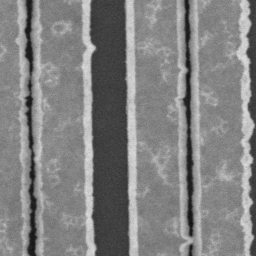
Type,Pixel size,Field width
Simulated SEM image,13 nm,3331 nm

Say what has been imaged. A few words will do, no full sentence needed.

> one or a few lines or trenches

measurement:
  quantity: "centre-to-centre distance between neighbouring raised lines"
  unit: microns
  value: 1.03